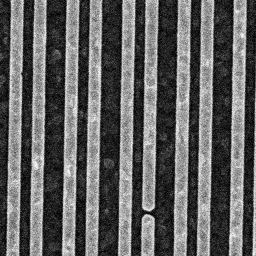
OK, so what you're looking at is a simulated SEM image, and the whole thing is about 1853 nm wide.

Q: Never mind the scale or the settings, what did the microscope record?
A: parallel lines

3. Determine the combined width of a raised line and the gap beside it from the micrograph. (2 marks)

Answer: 27.9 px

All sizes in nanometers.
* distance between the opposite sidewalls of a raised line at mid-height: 85.1